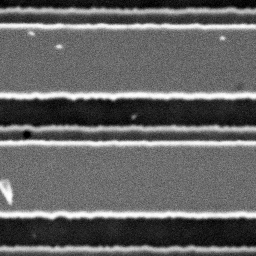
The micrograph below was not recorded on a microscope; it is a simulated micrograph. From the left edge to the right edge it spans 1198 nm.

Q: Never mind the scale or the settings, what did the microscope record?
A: lines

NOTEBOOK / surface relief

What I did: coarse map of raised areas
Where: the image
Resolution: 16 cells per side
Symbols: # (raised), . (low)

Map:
................
................
################
################
################
################
................
................
................
################
################
################
################
....#.......##..
................
................